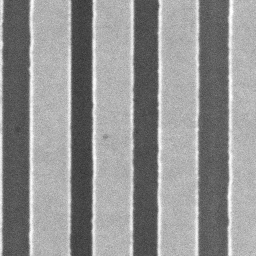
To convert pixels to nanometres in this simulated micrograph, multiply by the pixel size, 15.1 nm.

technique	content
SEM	lines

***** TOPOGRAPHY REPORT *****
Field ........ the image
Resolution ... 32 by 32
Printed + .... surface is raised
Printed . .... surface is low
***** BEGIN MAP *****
....+++++...+++++...+++++....+++
....+++++...+++++...+++++....+++
....+++++...+++++...+++++....+++
....+++++...+++++...+++++....+++
....+++++...+++++...+++++....+++
....+++++...+++++...+++++....+++
....+++++...+++++...+++++....+++
....+++++...+++++...+++++....+++
....+++++...+++++...+++++....+++
....+++++...+++++...+++++....+++
....+++++...+++++...+++++....+++
....+++++...+++++...+++++....+++
....+++++...+++++...+++++....+++
....+++++...+++++...+++++....+++
....+++++...+++++...+++++....+++
....+++++...+++++...+++++....+++
....+++++...+++++...+++++....+++
....+++++...+++++...+++++....+++
....+++++...+++++...+++++....+++
....+++++...+++++...+++++....+++
....+++++...+++++...+++++....+++
....+++++...+++++...+++++....+++
....+++++...++++....+++++....+++
....+++++...+++++...+++++....+++
....+++++...++++....+++++....+++
....+++++...++++....+++++....+++
....+++++...++++....+++++....+++
....+++++...++++....+++++....+++
....+++++...++++....+++++....+++
....+++++...++++....+++++....+++
....+++++...++++....+++++....+++
....+++++...++++....+++++....+++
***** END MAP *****